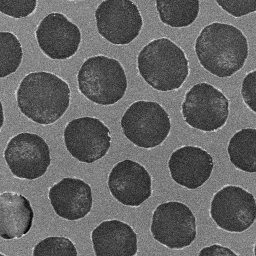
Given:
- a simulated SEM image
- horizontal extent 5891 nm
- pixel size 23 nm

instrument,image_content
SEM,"a regular array of holes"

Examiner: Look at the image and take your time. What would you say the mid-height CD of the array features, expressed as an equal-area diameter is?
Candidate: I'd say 1080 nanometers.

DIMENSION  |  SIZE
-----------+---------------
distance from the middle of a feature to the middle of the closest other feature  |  1.39 um